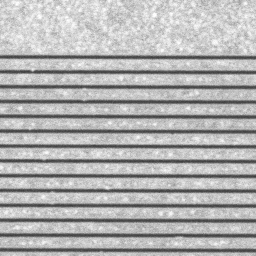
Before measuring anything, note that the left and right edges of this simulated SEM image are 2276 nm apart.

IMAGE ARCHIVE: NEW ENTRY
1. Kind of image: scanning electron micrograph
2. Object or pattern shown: parallel lines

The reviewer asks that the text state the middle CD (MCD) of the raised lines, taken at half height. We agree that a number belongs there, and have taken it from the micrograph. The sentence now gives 97.8 nanometres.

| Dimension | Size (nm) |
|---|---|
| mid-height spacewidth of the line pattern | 33.3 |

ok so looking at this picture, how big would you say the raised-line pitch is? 132 nanometers